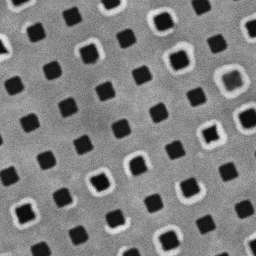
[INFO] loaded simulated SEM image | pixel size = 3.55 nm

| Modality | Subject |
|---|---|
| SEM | a regular array of holes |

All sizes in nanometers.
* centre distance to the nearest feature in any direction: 142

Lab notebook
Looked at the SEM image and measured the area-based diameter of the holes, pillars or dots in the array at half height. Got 66.8 nanometres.